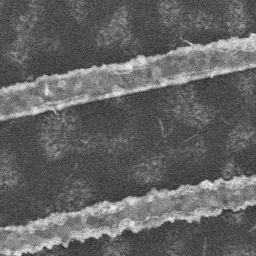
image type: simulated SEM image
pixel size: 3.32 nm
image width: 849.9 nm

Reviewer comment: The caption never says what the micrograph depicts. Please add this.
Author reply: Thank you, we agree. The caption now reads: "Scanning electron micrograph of one or a few lines or trenches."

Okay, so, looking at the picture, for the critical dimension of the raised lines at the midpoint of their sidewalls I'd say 28.3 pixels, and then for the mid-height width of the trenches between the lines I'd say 357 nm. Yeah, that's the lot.